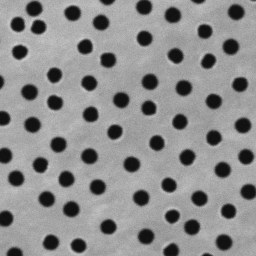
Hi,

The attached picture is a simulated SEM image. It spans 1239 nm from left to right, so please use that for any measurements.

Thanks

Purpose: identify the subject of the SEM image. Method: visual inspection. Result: a regular array of holes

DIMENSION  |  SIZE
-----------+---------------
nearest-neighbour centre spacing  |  142 nanometres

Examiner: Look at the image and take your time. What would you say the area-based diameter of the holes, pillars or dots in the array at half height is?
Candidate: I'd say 15.8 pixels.